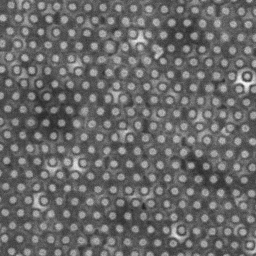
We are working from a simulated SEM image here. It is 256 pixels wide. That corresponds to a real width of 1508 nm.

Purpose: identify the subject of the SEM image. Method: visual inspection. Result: a regular array of raised bodies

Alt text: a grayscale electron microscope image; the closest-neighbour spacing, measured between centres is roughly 85.2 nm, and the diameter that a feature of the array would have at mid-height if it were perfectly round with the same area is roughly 37.6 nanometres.